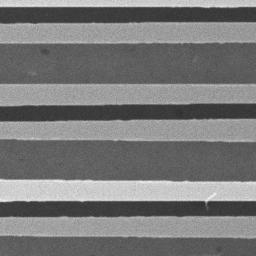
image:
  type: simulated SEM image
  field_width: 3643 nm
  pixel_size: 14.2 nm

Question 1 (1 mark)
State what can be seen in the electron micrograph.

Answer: lines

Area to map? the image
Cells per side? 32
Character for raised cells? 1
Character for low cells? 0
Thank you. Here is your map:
11111111111111111111111111111111
00000000000000000000000000000000
00000000000000000000000000000000
11111111111111111111111111111111
11111111111111111111111111111111
00000000000000000000000000000000
00000000000000000000000000000000
00000000000000000000000000000000
00000000000000000000000000000000
00000000000000000000000000000000
00000000000000000000000000000000
11111111111111111111111111111111
11111111111111111111111111111111
00000000000000000000000000000000
00000000000000000000000000000000
11111111111111111111111111111111
11111111111111111111111111111111
00000000000000111111111111111111
00000000000000000000000000000000
00000000000000000000000000000000
00000000000000000000000000000000
00000000000000000000000000000000
10000000000000000000000000000000
11111111111111111111111111111111
11111111111111111111111111111111
00000000000000000000000000000000
00000000000000000000000000000000
11111111111111111111111111111111
11111111111111111111111111111111
00000000000000010111111111111111
00000000000000000000000000000000
00000000000000000000000000000000